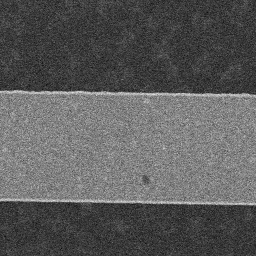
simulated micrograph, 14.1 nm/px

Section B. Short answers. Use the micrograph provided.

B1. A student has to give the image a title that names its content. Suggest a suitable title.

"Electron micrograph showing one or a few lines or trenches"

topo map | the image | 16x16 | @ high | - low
----------------
----------------
----------------
----------------
----------------
----------------
@@@@@@@@@@@@@@@@
@@@@@@@@@@@@@@@@
@@@@@@@@@@@@@@@@
@@@@@@@@@@@@@@@@
@@@@@@@@@@@@@@@@
@@@@@@@@@@@@@@@@
--@@@@@@@@@@@@@@
----------------
----------------
----------------